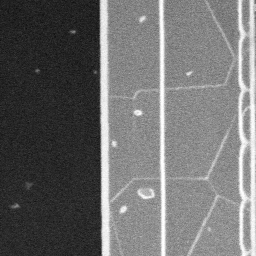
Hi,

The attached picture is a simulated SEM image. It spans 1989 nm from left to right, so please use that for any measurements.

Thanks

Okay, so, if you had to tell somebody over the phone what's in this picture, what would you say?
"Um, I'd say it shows wiring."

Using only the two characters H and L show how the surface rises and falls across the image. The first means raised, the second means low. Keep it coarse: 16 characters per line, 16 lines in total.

LLLLLLLHHHLLLLLH
LLLLLLLHHHLLLLLH
LLLLLLLHHHLLLLLH
LLLLLLLHHHLLLLLH
LLLLLLLHHHLLLLLH
LLLLLLLHHHLLLLLH
LLLLLLLHHHLLLLLH
LLLLLLLHHHLLLLLH
LLLLLLLHHHLLLLLH
LLLLLLLHHHLLLLLH
LLLLLLLHHHLLLLLH
LLLLLLLHHHLLLLLH
LLLLLLLHHHLLLLLH
LLLLLLLHHHLLLLLH
LLLLLLLHHHLLLLLH
LLLLLLLHHHLLLLLH